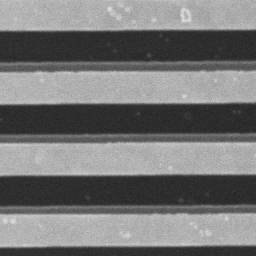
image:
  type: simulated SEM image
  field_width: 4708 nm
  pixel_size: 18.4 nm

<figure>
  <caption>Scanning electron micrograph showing lines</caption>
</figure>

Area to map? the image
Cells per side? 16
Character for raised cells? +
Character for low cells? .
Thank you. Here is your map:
++++++++++++++++
++++++++++++++++
................
................
++++++++++++++++
++++++++++++++++
................
................
++++++++++++++++
++++++++++++++++
++++++++++++++++
................
................
++++++++++++++++
++++++++++++++++
................